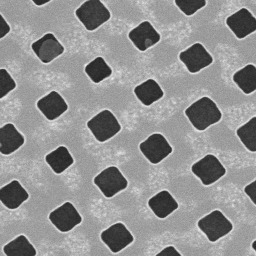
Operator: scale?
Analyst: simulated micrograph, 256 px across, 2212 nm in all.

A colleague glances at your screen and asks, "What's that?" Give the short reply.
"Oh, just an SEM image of a regular array of holes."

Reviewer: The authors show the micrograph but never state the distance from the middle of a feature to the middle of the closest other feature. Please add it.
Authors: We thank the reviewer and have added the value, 55.5 px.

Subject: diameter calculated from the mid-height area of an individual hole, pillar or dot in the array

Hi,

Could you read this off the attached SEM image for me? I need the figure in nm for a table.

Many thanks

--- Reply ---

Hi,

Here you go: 243